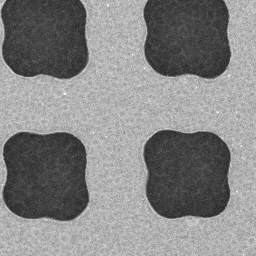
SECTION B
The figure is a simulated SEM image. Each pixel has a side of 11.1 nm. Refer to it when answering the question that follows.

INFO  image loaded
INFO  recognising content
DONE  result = holes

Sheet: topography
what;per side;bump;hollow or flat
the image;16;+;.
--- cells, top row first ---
.....++++.....++
.....++++.....++
.....++++.....++
.....++++.....++
+....+++++....++
++++++++++++++++
++++++++++++++++
++++++++++++++++
+....+++++....++
.....++++.....++
.....++++.....++
.....++++.....++
.....++++.....++
+....+++++...+++
++++++++++++++++
++++++++++++++++